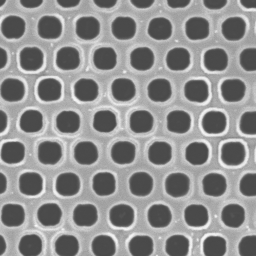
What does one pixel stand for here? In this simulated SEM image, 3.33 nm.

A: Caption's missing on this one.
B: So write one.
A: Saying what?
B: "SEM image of a regular array of holes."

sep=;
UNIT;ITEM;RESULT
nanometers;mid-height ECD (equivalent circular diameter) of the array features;75.8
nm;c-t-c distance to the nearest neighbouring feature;119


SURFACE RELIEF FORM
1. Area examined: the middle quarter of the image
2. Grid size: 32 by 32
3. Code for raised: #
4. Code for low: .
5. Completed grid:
...#####.....####.....####.....#
.#########.########.#######..###
################################
################################
###.....####.....#####....#####.
###.....####......###.....####..
###......###......###......###..
###.....####......###......###..
####....#####....####.....#####.
################################
################################
################################
...#####....#####....#####.....#
....####.....###......####.....#
....###......###......####.....#
....###......####.....####.....#
...#####....#####....#####.....#
################################
################################
#####.########..################
###.....####......####....#####.
###.....####......###......###..
###.....####......###......###..
###.....####.....####......###..
####...######...######....#####.
################################
################################
..######....######...######..###
...#####....#####.....####.....#
....###......###......###......#
....###......###......####.....#
...#####.....####.....####.....#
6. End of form